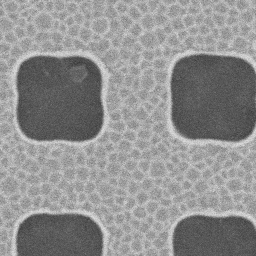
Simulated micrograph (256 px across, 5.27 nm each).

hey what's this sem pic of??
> holes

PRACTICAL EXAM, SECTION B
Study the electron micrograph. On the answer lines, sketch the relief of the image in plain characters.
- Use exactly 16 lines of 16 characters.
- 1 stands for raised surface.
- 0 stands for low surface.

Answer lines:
1111111111111111
1111111111111111
1111111111111111
1100011111100001
1000001111100000
1000000111100000
1000000111100000
1000000111100000
1000001111100000
1111111111111111
1111111111111111
1111111111111111
1111111111111111
1100001111110001
1000001111100000
1000000111100000